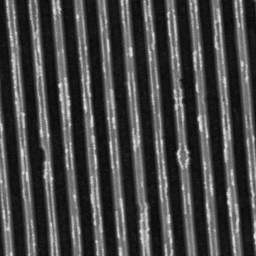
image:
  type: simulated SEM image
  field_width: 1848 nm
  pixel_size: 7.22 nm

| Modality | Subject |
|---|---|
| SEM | parallel lines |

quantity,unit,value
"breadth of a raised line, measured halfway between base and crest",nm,62.9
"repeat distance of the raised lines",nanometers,164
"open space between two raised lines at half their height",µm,0.0989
